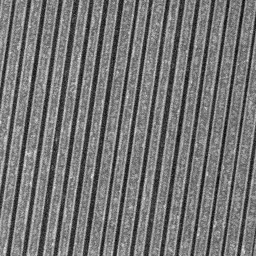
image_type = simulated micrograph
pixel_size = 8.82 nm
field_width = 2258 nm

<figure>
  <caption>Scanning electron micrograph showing parallel lines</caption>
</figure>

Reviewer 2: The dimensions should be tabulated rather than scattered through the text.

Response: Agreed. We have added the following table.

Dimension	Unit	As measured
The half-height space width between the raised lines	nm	49.2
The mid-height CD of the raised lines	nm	83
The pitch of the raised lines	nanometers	134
